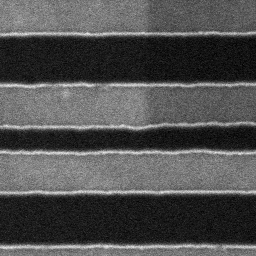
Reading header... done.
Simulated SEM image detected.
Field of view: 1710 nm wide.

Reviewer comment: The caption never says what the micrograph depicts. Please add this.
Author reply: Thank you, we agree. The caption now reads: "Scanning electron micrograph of lines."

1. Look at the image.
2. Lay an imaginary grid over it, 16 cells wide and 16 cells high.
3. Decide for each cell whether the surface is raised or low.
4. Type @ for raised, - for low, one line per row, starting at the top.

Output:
----------------
----------------
@@@@@@@@@@@@@@@@
@@@@@@@@@@@@@@@@
@@@@@@@@@@@@@@@@
----------------
----------------
----------------
@@@@@@@@@@@@@@@@
@@@@@@@@@@@@-@@@
----------------
----------------
@@@@@@@@@@@@@@@@
@@@@@@@@@@@@@@@@
@@@@@@@@@@@@@@@@
----------------